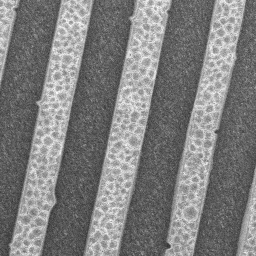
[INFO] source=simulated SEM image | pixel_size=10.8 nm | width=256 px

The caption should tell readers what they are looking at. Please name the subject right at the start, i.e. one or a few lines or trenches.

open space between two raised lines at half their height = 464 nm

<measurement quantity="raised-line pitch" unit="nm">806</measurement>